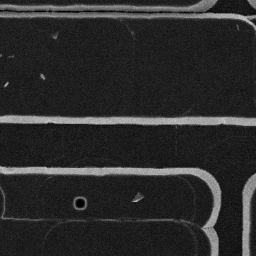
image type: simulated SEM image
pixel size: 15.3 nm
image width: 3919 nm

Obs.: wiring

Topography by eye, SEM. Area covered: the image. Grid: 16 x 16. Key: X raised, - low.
XXXXXXXXXXXXX---
XXXXXXXXXXXXXXXX
XXXXXXXXXXXXXXXX
XXXXXXXXXXXXXXXX
XXXXXXXXXXXXXXXX
XXXXXXXXXXXXXXXX
XXXXXXXXXXXXXXXX
---XXXXXXXXXXXXX
----------------
----------------
----------------
XXXXXXXXXXXXX---
XXXXXXXXXXXXXX-X
XXXXXXXXXXXXX--X
XXXXXXXXXXXXX--X
XXXXXXXXXXXXX--X